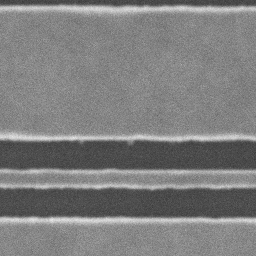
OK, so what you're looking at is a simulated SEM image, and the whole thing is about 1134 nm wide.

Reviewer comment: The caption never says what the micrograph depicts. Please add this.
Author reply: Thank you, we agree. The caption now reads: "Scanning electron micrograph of lines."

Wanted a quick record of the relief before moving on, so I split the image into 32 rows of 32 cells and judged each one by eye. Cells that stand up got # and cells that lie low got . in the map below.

................................
################################
################################
################################
################################
################################
################################
################################
################################
################################
################################
################################
################################
################################
################################
################################
################################
...######..........##########..#
................................
................................
................................
################################
################################
..................##............
................................
................................
................................
################################
################################
################################
################################
################################